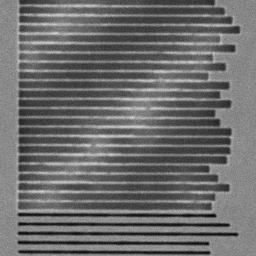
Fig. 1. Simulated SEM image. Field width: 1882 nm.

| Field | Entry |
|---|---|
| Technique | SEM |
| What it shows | groups of lines, slits or small figures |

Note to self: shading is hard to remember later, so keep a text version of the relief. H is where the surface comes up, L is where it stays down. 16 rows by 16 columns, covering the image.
HLLLLLLLLLLLLLHH
HLLLLLLLLLLLLLLH
HLLLLLLLLLLLLLHH
HLLLLLLLLLLLLLHH
HLLLLLLLLLLLLHHH
HLLLLLLLLLLLLLHH
HLLLLLLLLLLLLLHH
HLLLLLLLLLLLLLHH
HLLLLLLLLLLLLLHH
HLLLLLLLLLLLLLHH
HLLLLLLLLLLLLHHH
HLLLLLLLLLLLLLHH
HLLLLLLLLLLLLHHH
HHHHHHHHHHHHHHHH
HHHHHHHHHHHHHHHH
HHHHHHHHHHHHHHHH